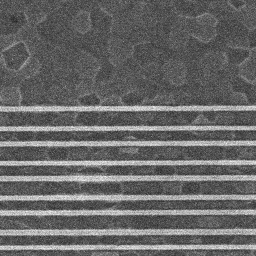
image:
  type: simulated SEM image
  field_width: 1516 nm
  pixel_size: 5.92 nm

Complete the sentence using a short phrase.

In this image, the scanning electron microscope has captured parallel lines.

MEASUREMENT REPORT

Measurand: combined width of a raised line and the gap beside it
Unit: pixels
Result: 17.3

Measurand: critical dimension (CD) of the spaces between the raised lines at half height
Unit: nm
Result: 77.3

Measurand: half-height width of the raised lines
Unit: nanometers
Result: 25.9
